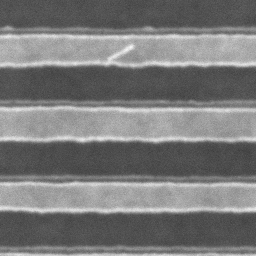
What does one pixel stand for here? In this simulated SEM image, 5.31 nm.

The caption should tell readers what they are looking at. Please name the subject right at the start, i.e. lines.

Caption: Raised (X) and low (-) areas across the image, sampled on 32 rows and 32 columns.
--------------------------------
--------------------------------
--------------------------------
--------------------------------
XXXXXXXXXXX-----X---XXX--XXXXXX-
XXXXXXXXXXXXXXXXXXXXXXXXXXXXXXXX
XXXXXXXXXXXXXXXXXXXXXXXXXXXXXXXX
XXXXXXXXXXXXXXXXXXXXXXXXXXXXXXXX
--------------------------------
--------------------------------
--------------------------------
--------------------------------
--------------------------------
XXXXXXXXXXXXXXXX-----X----------
XXXXXXXXXXXXXXXXXXXXXXXXXXXXXXXX
XXXXXXXXXXXXXXXXXXXXXXXXXXXXXXXX
XXXXXXXXXXXXXXXXXXXXXXXXXXXXXXXX
X-XXXXX--XXXXXXXXXXXXXXXXXXXXXXX
--------------------------------
--------------------------------
--------------------------------
--------------------------------
--------------------------------
XXXXXXXXXXXXXXXXXXXXXXXXXXXXXXXX
XXXXXXXXXXXXXXXXXXXXXXXXXXXXXXXX
XXXXXXXXXXXXXXXXXXXXXXXXXXXXXXXX
--------------------------------
--------------------------------
--------------------------------
--------------------------------
--------------------------------
--------------------------------